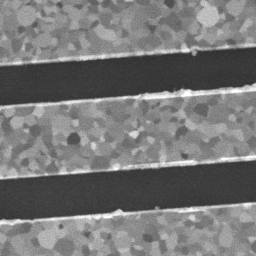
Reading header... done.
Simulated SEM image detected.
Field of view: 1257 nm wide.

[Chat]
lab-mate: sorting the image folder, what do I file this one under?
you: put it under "one or a few lines or trenches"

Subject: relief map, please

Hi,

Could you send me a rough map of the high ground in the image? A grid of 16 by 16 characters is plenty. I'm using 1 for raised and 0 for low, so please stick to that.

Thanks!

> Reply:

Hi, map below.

1111111111111111
1111111111111111
1111111111111111
1111111100000000
0000000000000000
0000000000000011
0001111111111111
1111111111111111
1111111111111111
1111111111111111
1111111100000000
0000000000000000
0000000000000000
0000011111111111
1111111111111111
1111111111111111